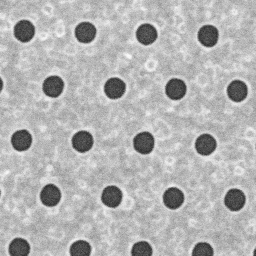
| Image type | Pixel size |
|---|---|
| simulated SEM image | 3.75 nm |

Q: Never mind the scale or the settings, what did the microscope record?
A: a regular array of holes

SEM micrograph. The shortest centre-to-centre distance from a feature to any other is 229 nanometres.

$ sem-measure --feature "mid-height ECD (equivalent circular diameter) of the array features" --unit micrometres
0.0843